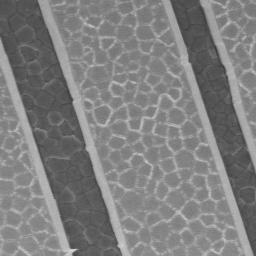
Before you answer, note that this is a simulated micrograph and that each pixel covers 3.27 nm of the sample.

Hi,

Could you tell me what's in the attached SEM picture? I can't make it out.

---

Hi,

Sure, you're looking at one or a few lines or trenches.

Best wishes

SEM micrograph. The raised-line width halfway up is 382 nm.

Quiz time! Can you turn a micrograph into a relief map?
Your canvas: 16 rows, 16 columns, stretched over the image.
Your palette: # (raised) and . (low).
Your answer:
...########..###
...########..###
....#######...##
....#######...##
....########..##
#....#######...#
#....#######...#
#....########..#
##...########..#
##....#######...
##....########..
###...########..
###....#######..
###....########.
####...########.
####....#######.